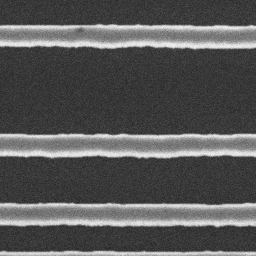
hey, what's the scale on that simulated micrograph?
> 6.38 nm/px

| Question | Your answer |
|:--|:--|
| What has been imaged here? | lines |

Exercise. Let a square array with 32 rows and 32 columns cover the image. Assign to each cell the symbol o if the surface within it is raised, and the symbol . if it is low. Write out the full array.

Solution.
................................
................................
................................
oooooooooooooooooooooooooooooooo
oooooooooooooooooooooooooooooooo
oooooooooooooooooooooooooooooooo
................................
................................
................................
................................
................................
................................
................................
................................
................................
................................
................................
oooooooooooooooooooooooooooooooo
oooooooooooooooooooooooooooooooo
......oo.........ooooo..........
................................
................................
................................
................................
................................
oo..oooooo...o.................o
oooooooooooooooooooooooooooooooo
oooooooooooooooooooooooooooooooo
................................
................................
................................
......o.oo.oooo..........ooo....